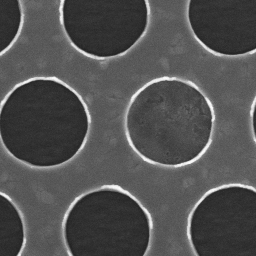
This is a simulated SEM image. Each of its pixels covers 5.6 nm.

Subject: holes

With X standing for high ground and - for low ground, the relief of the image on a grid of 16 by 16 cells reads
-XXX-----XXX----
-XXX-----XXX----
-XXX-----XXXX---
XXXXXX-XXXXXXXXX
XXXXXXXXXXXXXXXX
X---XXXXX---XXXX
-----XXX-----XXX
-----XXX-----XXX
-----XXX-----XXX
X----XXXX---XXXX
XXXXXXXXXXXXXXXX
XXXXXXXXXXXXXXXX
XXXXX---XXXXX---
-XXX-----XXX----
-XXX-----XXX----
-XXX-----XXX----